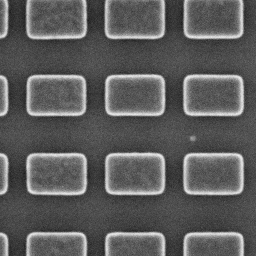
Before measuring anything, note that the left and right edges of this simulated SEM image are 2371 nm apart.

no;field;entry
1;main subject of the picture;wiring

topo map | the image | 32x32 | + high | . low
+..++++++++..++++++++..+++++++..
+..++++++++..++++++++..+++++++..
+..++++++++..++++++++..+++++++..
+..++++++++..++++++++..+++++++..
....++++++....++++++...+++++++..
................................
................................
................................
................................
....++++++....++++++....++++++..
+..++++++++..++++++++..+++++++..
+..++++++++..++++++++..+++++++..
+..++++++++..++++++++..+++++++..
+..++++++++..++++++++..+++++++..
................................
................................
................................
................................
................................
+...++++++....++++++...+++++++..
+..++++++++..++++++++..+++++++..
+..++++++++..++++++++..+++++++..
+..++++++++..++++++++..+++++++..
+...+++++++..++++++++..+++++++..
................................
................................
................................
................................
................................
+...++++++...+++++++...+++++++..
+..++++++++..++++++++..+++++++..
+..++++++++..++++++++..+++++++..